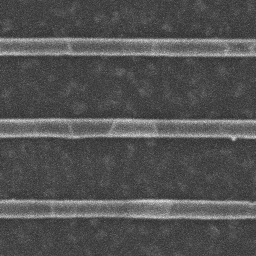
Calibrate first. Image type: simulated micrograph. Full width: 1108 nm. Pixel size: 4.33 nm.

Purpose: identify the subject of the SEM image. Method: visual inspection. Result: one or a few lines or trenches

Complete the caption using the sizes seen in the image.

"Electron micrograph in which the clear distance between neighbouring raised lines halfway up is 281 nm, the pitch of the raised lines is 0.35 µm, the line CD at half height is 69.2 nanometers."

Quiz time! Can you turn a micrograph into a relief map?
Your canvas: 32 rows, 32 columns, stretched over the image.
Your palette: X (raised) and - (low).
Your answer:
--------------------------------
--------------------------------
--------------------------------
--------------------------------
--------------------------------
XXXXXXXXXXXXXXXXXXXXXXXXXXXXXXXX
XXXXXXXXXXXXXXXXXXXXXXXXXXXXXXXX
--------------------------------
--------------------------------
--------------------------------
--------------------------------
--------------------------------
--------------------------------
--------------------------------
--------------------------------
XXXXXXXXXXXXXXXXXXXXXXXXXXXXXXXX
XXXXXXXXXXXXXXXXXXXXXXXXXXXXXXXX
--------------------------------
--------------------------------
--------------------------------
--------------------------------
--------------------------------
--------------------------------
--------------------------------
--------------------------------
XXXXXXXXXXXXXXXXXXXXXXXXXXXXXXXX
XXXXXXXXXXXXXXXXXXXXXXXXXXXXXXXX
--------------------------------
--------------------------------
--------------------------------
--------------------------------
--------------------------------